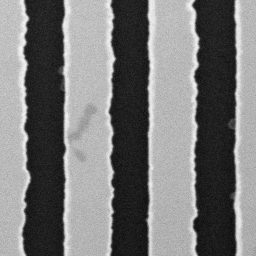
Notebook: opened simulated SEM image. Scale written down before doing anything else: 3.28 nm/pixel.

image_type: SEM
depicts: lines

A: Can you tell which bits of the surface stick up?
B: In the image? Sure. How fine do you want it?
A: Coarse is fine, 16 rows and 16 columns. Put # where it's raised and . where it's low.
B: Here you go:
##..###..###...#
##..###..###...#
##..###..###...#
##..###..###...#
##..###..###...#
##..###..###...#
##..###..###...#
##..###..###...#
##..###..###...#
##..###..###...#
##..###..###...#
##..###..###...#
##..###..###...#
##..###..###...#
#...###..###...#
#...###..###...#